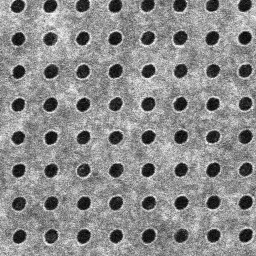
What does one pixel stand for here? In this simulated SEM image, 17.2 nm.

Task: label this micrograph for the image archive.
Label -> a regular array of raised bodies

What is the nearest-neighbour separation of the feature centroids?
0.555 um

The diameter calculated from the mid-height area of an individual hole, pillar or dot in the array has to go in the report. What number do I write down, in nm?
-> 278